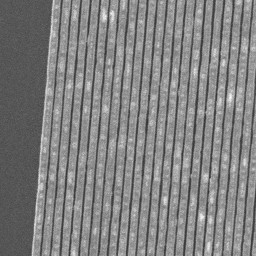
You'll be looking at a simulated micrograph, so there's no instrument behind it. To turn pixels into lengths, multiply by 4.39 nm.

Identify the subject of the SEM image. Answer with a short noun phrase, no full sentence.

parallel lines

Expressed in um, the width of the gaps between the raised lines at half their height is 0.0087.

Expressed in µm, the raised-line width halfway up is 0.0301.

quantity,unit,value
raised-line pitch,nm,41.8